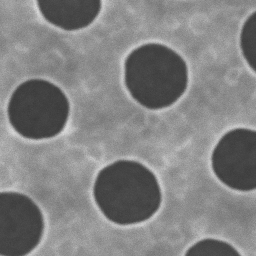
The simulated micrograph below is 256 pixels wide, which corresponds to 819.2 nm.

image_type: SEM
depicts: holes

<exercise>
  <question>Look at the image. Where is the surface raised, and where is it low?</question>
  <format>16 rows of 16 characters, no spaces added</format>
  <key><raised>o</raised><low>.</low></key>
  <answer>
oo....oooooooooo
ooo...ooooooooo.
ooooooooooooooo.
oooooooo...oooo.
oooooooo....oooo
o...oooo....oooo
o...ooooo..ooooo
o...oooooooooooo
o..ooooooooooo..
ooooooooooooo...
ooooooo..oooo...
oooooo....oooo..
..oooo....oooooo
...oooo..ooooooo
...ooooooooooooo
..oooooooooo...o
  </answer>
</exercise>